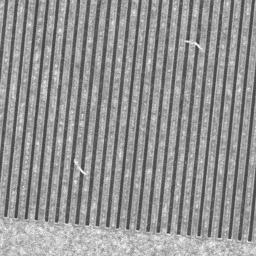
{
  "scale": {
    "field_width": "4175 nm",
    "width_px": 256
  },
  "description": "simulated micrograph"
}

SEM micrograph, parallel lines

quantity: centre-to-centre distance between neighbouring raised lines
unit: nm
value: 166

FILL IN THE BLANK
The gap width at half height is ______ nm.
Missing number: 68.9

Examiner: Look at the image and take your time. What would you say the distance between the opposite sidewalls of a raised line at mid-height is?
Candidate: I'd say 0.0974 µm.